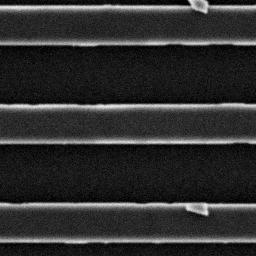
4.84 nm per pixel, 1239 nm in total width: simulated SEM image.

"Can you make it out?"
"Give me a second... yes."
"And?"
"lines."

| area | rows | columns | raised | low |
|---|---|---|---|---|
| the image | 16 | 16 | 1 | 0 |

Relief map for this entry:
1111111111111111
1111111111111111
1111111111111111
0000000000000000
0000000000000000
0000000000000000
0000000000000000
1111111111111111
1111111111111111
0000000000000000
0000000000000000
0000000000000000
0000000000000000
1111111111111111
1111111111111111
0000000000000000